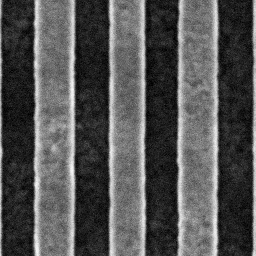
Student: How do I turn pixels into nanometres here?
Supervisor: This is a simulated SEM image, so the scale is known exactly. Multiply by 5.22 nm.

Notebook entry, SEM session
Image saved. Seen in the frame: lines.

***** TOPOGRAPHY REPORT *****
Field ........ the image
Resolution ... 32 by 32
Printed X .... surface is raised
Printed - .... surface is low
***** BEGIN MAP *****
----XXXXX-----XXXX----XXXXX-----
----XXXXX-----XXXX-----XXXX-----
----XXXXX-----XXXX----XXXXX-----
----XXXXX-----XXXX----XXXXX-----
----XXXXX-----XXXX----XXXXX-----
----XXXXX-----XXXX----XXXXX-----
----XXXXX-----XXXX----XXXXX-----
----XXXXX-----XXXX----XXXXX-----
----XXXXX-----XXXX----XXXXX-----
----XXXXX-----XXXX----XXXXX-----
----XXXXX-----XXXX----XXXXX-----
----XXXXX-----XXXX----XXXXX-----
----XXXXX-----XXXX----XXXXX-----
----XXXXX-----XXXX----XXXXX-----
----XXXXX-----XXXX----XXXXX-----
----XXXXX-----XXXX----XXXXX-----
----XXXXX-----XXXX----XXXXX-----
----XXXXX-----XXXX----XXXXX-----
----XXXXX-----XXXX----XXXXX-----
----XXXXX-----XXXX----XXXXX-----
----XXXXX-----XXXX----XXXXX-----
----XXXXX-----XXXX----XXXXX-----
----XXXXX-----XXXX----XXXXX-----
----XXXXX-----XXXX----XXXXX-----
----XXXXX-----XXXX----XXXXX-----
----XXXXX-----XXXX----XXXXX-----
----XXXXX-----XXXX----XXXXX-----
----XXXXX-----XXXX----XXXXX-----
----XXXXX-----XXXX----XXXXX-----
----XXXXX-----XXXX----XXXXX-----
----XXXXX-----XXXX----XXXXX-----
----XXXXX-----XXXX----XXXXX-----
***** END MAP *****